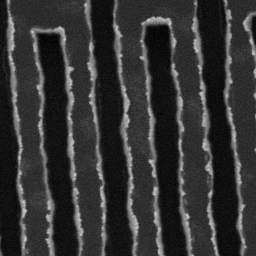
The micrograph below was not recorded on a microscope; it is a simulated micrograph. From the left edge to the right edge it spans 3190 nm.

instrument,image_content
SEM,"parallel lines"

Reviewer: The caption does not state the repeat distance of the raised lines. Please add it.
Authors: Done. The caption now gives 676 nm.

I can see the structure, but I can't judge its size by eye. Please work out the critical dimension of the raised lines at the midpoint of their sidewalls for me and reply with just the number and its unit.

356 nm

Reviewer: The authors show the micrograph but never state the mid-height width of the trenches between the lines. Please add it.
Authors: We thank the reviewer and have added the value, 325 nm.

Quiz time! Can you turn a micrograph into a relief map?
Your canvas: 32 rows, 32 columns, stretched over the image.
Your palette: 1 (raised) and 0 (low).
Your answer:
01111111111000111111111110001111
01111111111000111111111110001111
01111111111000111111111100001110
01111111111000111100011110001110
01111000111000011100011110001111
01111000111100011100001110001111
01111000111100011100001110001111
01111000111100011100011110001111
01111000111100011100011110001111
00111000111100011110001110001111
00111000111100011110001110001111
00111000011100011110001111001111
00111000011100001110001111001111
00111000011100011110001111001111
00111000011100011110001111000111
00111000011100011110001111000111
00111000011100011110000111000111
00111000011100001110001111000111
00111000011100001110001111000111
00111100011100001110000111000111
00111100011110001110000111000011
00111100011110001110001111100011
00111100011110001111001111100011
00111100011110001111000111100011
00111100011110001111000111000011
00011100011110001111000111000011
00011110001110001111000111000011
00011100001110001111000111100011
00011110001110000111000111100011
00011100001110000111000111100011
00011100001110000111000011100011
00011110001110000111000011100011